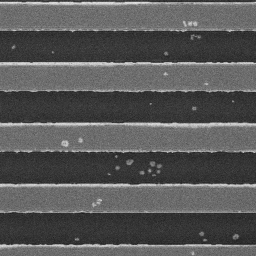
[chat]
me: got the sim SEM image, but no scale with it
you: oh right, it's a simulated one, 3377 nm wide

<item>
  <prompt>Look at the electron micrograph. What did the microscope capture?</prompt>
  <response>lines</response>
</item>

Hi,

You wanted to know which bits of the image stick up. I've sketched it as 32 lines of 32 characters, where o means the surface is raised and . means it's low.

oooo.o.o.ooo..oooooooooooooooooo
oooooooooooooooooooooooooooooooo
oooooooooooooooooooooooooooooooo
oooooooooooooooooooooooooooooooo
................................
................................
................................
................................
oooooooooooooooooooooooooooooooo
oooooooooooooooooooooooooooooooo
oooooooooooooooooooooooooooooooo
................................
................................
................................
................................
..ooooo....oooooo...............
oooooooooooooooooooooooooooooooo
oooooooooooooooooooooooooooooooo
oooooooooooooooooooooooooooooooo
................................
................................
................................
................................
oooooooooooooooooooooooooooooooo
oooooooooooooooooooooooooooooooo
oooooooooooooooooooooooooooooooo
oooooooooooooooooooooooooooooooo
................................
................................
................................
................................
oooooooooooooooooooooooooooooooo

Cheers